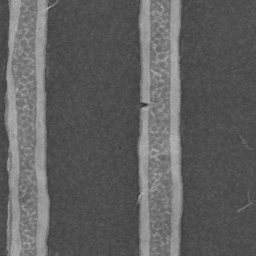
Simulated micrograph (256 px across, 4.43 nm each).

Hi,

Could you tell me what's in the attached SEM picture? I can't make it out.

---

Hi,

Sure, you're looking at one or a few lines or trenches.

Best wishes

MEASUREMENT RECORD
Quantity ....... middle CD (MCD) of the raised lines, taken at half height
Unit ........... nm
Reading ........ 129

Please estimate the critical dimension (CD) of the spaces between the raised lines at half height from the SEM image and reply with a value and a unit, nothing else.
0.461 microns